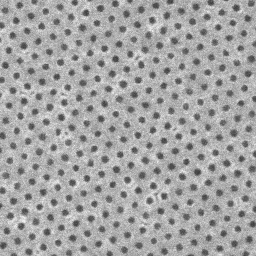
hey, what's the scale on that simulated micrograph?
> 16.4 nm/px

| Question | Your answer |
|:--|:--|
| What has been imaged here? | a regular array of holes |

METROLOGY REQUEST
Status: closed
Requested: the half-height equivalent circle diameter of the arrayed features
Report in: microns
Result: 0.129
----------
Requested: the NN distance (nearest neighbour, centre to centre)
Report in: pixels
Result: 14.9